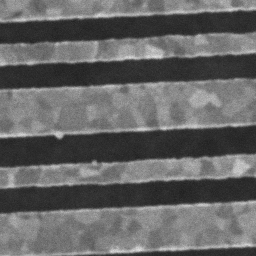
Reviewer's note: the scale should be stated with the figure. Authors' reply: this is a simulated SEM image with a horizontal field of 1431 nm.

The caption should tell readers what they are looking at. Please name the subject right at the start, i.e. lines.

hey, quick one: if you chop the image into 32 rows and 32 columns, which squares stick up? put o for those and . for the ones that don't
oooooooooooooooooooooooooooooooo
oooooooooooooooooooooooo........
oooo............................
................................
.....................oo.oooooooo
.....ooooooooooooooooooooooooooo
oooooooooooooooooooooooooooooooo
oooooooooooooo..................
................................
................................
..................oooooooooooooo
oooooooooooooooooooooooooooooooo
oooooooooooooooooooooooooooooooo
oooooooooooooooooooooooooooooooo
oooooooooooooooooooooooooooooooo
oooooooooooooooooooooooooooooooo
oooooooooooo....................
................................
................................
............................oooo
.........ooooooooooooooooooooooo
oooooooooooooooooooooooooooooooo
ooooooooooooooooooo.o...........
................................
................................
............................oooo
......oooooooooooooooooooooooooo
oooooooooooooooooooooooooooooooo
oooooooooooooooooooooooooooooooo
oooooooooooooooooooooooooooooooo
oooooooooooooooooooooooooooooooo
oooooooooooooooo................